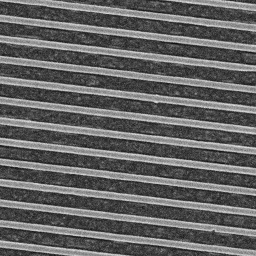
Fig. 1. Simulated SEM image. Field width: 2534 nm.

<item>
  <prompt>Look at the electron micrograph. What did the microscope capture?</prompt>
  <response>parallel lines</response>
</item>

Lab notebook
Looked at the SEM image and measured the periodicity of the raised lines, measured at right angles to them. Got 202 nanometres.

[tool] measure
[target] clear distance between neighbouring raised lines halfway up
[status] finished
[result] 0.136 microns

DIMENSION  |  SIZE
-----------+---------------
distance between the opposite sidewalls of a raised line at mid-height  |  0.0675 micrometres